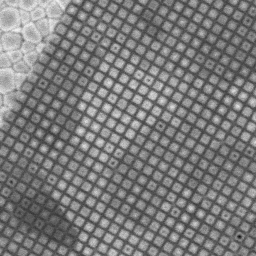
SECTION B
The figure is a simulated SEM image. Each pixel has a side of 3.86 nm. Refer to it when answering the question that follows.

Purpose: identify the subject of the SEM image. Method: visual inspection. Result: a regular array of raised bodies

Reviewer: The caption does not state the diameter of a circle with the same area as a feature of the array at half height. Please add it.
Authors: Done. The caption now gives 34.3 nm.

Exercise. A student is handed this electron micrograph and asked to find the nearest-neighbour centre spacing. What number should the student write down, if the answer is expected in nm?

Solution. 42.7